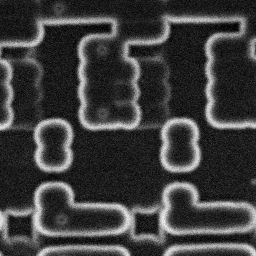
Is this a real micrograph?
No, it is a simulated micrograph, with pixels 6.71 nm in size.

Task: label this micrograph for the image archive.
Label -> wiring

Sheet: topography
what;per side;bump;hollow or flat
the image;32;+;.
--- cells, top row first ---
++++++++++++++++++++++++++++++++
++++++++++++++++++++++++++++++++
++++++++++++++++++++++++++++++++
+++++.........+++++++.........++
+++++......++++++++++......+++++
++++......++++++..........++++++
..........++++++..........++++++
..........+++++++.........++++++
+.........+++++++.........++++++
+.........+++++++.........++++++
+.........+++++++.........++++++
++........+++++++.........++++++
+.........+++++++.........++++++
+.........+++++++.........++++++
++........+++++++.........++++++
+....+++..+++++++....+++...+++++
....+++++...........+++++.......
.....++++...........+++++.......
.....++++...........+++++.......
.....++++...........+++++.......
.....++++...........+++++.......
................................
................................
.....++++............+++........
.....++++............++++.......
.....+++++...........++++.+++...
.....+++++++++++.....+++++++++++
.....+++++++++++....++++++++++++
.....+++++++++++.....++++++++++.
................................
................................
.....+++++++++++.....+++++++++++